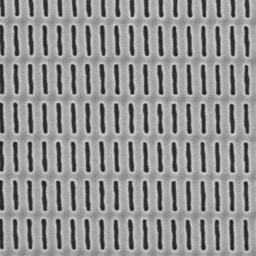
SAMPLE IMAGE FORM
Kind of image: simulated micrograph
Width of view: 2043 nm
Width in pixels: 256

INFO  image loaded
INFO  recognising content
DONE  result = a regular array of holes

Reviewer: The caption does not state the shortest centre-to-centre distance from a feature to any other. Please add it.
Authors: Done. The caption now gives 113 nm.